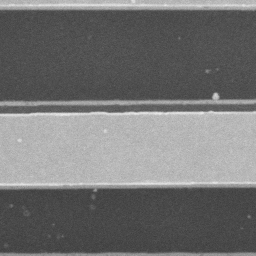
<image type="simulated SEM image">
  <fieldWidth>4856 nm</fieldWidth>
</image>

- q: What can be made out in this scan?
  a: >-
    lines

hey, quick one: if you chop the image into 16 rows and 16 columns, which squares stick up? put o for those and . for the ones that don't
................
................
................
................
................
................
................
oooooooooooooooo
oooooooooooooooo
oooooooooooooooo
oooooooooooooooo
oooooooooooo....
................
................
................
................